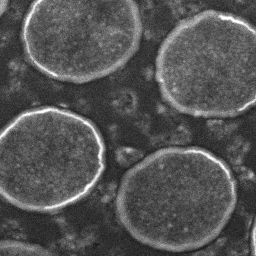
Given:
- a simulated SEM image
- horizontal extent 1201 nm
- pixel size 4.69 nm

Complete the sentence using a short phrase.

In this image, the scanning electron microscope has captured raised bodies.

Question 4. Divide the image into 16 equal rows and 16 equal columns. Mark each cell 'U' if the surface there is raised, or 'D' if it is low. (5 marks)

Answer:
DDUUUUUUDDDDDDDD
DDUUUUUUUDDDUUUD
DDUUUUUUUDDUUUUU
DDUUUUUUDDUUUUUU
DDDUUUUDDDUUUUUU
DDDDDDDDDDUUUUUU
DDDDDDDDDDDUUUUU
DUUUUDDDDDDDDDDD
UUUUUUDDDDDDDDDD
UUUUUUDDDDUUUDDD
UUUUUUDDDUUUUUDD
UUUUUUDDUUUUUUUD
DUUUUDDUUUUUUUUD
DDDDDDDDUUUUUUDD
DDDDDDDDUUUUUUDD
UUDDDDDDDDDDDDDD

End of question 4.